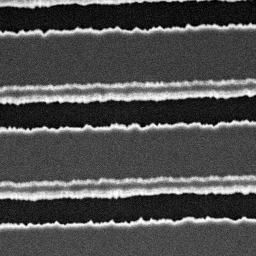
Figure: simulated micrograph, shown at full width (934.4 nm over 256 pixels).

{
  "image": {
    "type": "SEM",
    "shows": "lines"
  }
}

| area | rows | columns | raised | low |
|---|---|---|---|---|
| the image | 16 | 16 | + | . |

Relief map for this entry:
................
................
++++++++++++++++
++++++++++++++++
++++++++++++++++
++++++++++++++++
................
................
++++++++++++++++
++++++++++++++++
++++++++++++++++
++++++++++++++++
................
................
++++++++++++++++
++++++++++++++++